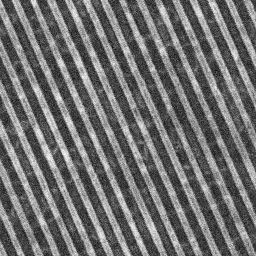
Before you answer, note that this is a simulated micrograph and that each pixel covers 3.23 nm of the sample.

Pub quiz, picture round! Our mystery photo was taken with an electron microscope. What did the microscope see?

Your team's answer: parallel lines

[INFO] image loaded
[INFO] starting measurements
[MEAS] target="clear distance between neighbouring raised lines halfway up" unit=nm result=35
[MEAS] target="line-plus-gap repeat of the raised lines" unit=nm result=52.6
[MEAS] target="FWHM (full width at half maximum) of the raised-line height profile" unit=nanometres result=19.2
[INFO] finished